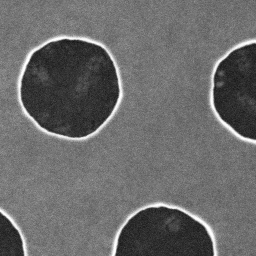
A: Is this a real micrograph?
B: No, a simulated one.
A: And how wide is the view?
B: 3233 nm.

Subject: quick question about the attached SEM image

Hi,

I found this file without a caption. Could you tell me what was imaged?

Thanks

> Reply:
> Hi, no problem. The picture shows holes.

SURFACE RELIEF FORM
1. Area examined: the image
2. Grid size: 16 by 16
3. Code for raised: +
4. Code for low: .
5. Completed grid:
++++++++++++++++
++++++++++++++++
++++.+++++++++++
++.....+++++++..
+......++++++...
+......++++++...
+......++++++...
++.....+++++++..
++++.++++++++++.
++++++++++++++++
++++++++++++++++
++++++++++++++++
++++++++++++++++
++++++++....++++
.+++++++.....+++
.++++++......+++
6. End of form